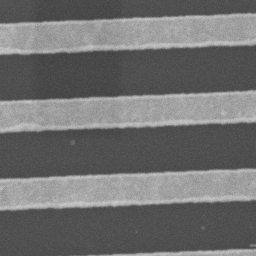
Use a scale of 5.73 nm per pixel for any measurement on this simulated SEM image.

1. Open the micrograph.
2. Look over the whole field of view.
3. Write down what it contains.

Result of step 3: lines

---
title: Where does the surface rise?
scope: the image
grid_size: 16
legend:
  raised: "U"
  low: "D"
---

DDDDDDDDDDDDDDDD
UUUUUUUUUUUUUUUU
UUUUUUUUUUUUUUUU
DDDDDDDDDDDDDDDD
DDDDDDDDDDDDDDDD
DDDDDDDDDDDDDDDD
UUUUUUUUUUUUUUUU
UUUUUUUUUUUUUUUU
DDDDDDDDDDDDDDDD
DDDDDDDDDDDDDDDD
DDDDDDDDDDDDDDDD
UUUUUUUUUUUUUUUU
UUUUUUUUUUUUUUDD
DDDDDDDDDDDDDDDD
DDDDDDDDDDDDDDDD
DDDDDDDDDDDDDDDD